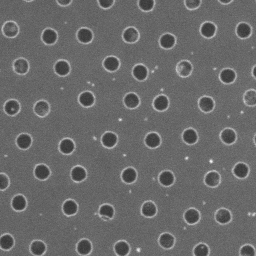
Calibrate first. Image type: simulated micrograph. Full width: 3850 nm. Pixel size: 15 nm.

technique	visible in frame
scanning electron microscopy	a regular array of raised bodies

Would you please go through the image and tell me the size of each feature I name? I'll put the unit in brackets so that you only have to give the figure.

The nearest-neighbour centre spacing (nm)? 528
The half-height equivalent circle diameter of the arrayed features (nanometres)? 251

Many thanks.